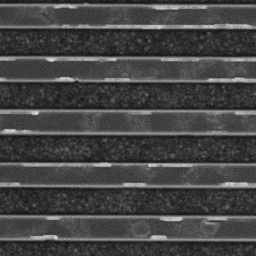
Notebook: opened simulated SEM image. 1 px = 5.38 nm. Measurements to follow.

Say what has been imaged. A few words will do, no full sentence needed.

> parallel lines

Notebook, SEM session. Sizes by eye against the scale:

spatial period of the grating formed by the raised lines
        285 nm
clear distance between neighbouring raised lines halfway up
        157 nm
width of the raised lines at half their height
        24.3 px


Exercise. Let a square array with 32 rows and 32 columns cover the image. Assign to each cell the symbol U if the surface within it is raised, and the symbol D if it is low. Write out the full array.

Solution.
DDDDDDDDDDDDDDDDDDDDDDDDDDDDDDDD
UUUUUUUUUUUUUUUUUUUUUUUUUUUUUUUU
UUUUUUUUUUUUUUUUUUUUUUUUUUUUUUUU
DDDDDDDDDDDDDDDDDUUUUDDDDDDDDDDD
DDDDDDDDDDDDDDDDDDDDDDDDDDDDDDDD
DDDDDDDDDDDDDDDDDDDDDDDDDDDDDDDD
DDDDDDDDDDDDDDDDDDDDDDDDDDDDDDDD
UUUUUUUUUUUUUUUUUUUUUUUUUUUUUUUU
UUUUUUUUUUUUUUUUUUUUUUUUUUUUUUUU
UUUUUUUUUUUUUUUUUUUUUUUUUUUUUUUU
DDDDDDDDDDDDDDDDDDDDDDDDDDDDDDDD
DDDDDDDDDDDDDDDDDDDDDDDDDDDDDDDD
DDDDDDDDDDDDDDDDDDDDDDDDDDDDDDDD
DDDDDDDDDDDDDDDDDDDDDDDDDDDDDDDD
UUUUUUUUUUUUUUUUUUUUUUUUUUUUUUUU
UUUUUUUUUUUUUUUUUUUUUUUUUUUUUUUU
UUUUUUUUUUUUUUUUUUUUUUUUUUUUUUUU
DDDDDDDDDDDDDDDDDDDDDDDDDDDDDDDD
DDDDDDDDDDDDDDDDDDDDDDDDDDDDDDDD
DDDDDDDDDDDDDDDDDDDDDDDDDDDDDDDD
UUUUUUUUUUDDUUDDDDDDDDDDDDDDDDDD
UUUUUUUUUUUUUUUUUUUUUUUUUUUUUUUU
UUUUUUUUUUUUUUUUUUUUUUUUUUUUUUUU
DDDDDDDDDDDDDDDDDDDDDDDDDDDDDDDD
DDDDDDDDDDDDDDDDDDDDDDDDDDDDDDDD
DDDDDDDDDDDDDDDDDDDDDDDDDDDDDDDD
DDDDDDDDDDDDDDDDDDDDDDDDDDDDDDDD
UUUUUUUUUUUUUUUUUUUUUUUUUUUUUUUU
UUUUUUUUUUUUUUUUUUUUUUUUUUUUUUUU
UUUUUUUUUUUUUUUUUUUUUUUUUUUUUUUU
DDDDDDDDDDDDDDDDDDDDDDDDDDDDDDDD
DDDDDDDDDDDDDDDDDDDDDDDDDDDDDDDD